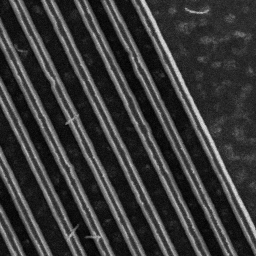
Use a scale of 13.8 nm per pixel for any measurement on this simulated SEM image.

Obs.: parallel lines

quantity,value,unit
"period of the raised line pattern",381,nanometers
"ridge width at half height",134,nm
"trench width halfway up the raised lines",254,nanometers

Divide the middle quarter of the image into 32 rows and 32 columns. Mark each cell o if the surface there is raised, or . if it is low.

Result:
..ooo......oo.....oo.....ooo....
...ooo.....ooo....ooo.....oo....
...ooo......oo....ooo.....ooo...
....oo......ooo....ooo.....oo...
....ooo......oo.....oo.....oo...
.....oo......ooo....oo......oo..
.....ooo......oo.....oo.....ooo.
......oo......ooo....oo......oo.
o......oo......oo....ooo.....oo.
oo.....oo......ooo....oo......oo
oo.....ooo......oo.....oo.....oo
ooo.....oo......ooo....oo......o
ooo.....ooo......oo.....oo.....o
.ooo.....oo......ooo....oo......
.ooo.....ooo.....ooo....ooo.....
..oo......oo......ooo....oo.....
..ooo.....ooo.....ooo....ooo....
...oo......oo......ooo....oo....
...ooo.....ooo.....ooo....ooo...
....oo......oo......ooo....oo...
....ooo.....ooo.....ooo....ooo..
.....oo......oo......oo.....oo..
.....ooo.....ooo.....ooo....ooo.
o.....oo......oo......oo.....oo.
o.....ooo.....ooo.....ooo....ooo
oo.....oo......oo......oo.....oo
oo.....ooo.....ooo.....ooo....oo
ooo.....oo......oo......ooo....o
.oo.....ooo.....ooo.....ooo....o
.oo......oo.....ooo......oo....o
.ooo.....ooo.....ooo.....ooo....
..oo......oo.....ooo......oo....